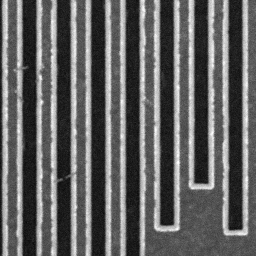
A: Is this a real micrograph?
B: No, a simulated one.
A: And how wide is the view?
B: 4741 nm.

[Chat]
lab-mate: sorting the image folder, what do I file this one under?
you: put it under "parallel lines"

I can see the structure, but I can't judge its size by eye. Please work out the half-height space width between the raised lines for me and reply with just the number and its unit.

347 nanometers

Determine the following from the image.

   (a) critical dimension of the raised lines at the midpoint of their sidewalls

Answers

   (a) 294 nanometers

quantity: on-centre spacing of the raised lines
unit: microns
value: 0.635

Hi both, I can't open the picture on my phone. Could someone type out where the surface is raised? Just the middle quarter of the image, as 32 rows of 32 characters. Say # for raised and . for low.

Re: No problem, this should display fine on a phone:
..####.....####....####.....####
..####.....####....####.....####
..####.....####....####.....####
..####.....####....####.....####
..####.....####....####.....####
..####.....####....####.....####
..####.....####....####.....####
..####.....####....####.....####
..####.....####....####.....####
..####.....####....####.....####
..####.....####....####.....####
..####.....####....####.....####
..####.....####....####.....####
..####.....####....####.....####
..####.....####....####.....####
..####.....####....####.....####
..####.....####....####.....####
..####.....####....####.....####
..####.....####....####.....####
..####.....####....####.....####
..####.....####.....###.....####
..####.....####.....###.....####
..####.....####.....###.....####
..####.....####.....###.....####
..####.....####.....###.....####
..####.....####.....###.....####
..####.....####.....###.....####
..####.....####.....###.....####
..####.....####.....###.....####
..####.....####.....###.....####
..####.....####.....###.....####
..####.....####.....###.....####